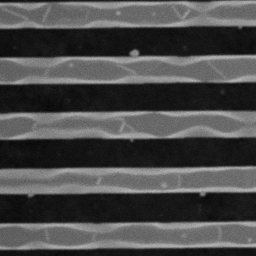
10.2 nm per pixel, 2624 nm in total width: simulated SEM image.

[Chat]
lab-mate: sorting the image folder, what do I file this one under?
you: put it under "wiring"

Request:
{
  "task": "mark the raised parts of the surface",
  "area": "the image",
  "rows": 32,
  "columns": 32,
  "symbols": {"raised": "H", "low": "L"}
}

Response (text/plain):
HHLLLHHHHLLLLLLHHHHHHHHHLLLHHHHH
HHHHHHHHHHHHHHHHHHHHHHHHHHHHHHHH
HHHHHHHHHHHHHHHHHHHHHHHHHHHHHHHH
LLLLLLLLLLLLLLLLLLLLLLLLLLLLLLLL
LLLLLLLLLLLLLLLLLLLLLLLLLLLLLLLL
LLLLLLLLLLLLLLLLLLLLLLLLLLLLLLLL
LLLLLLLLLLLLLLLLLLLLLLLLLLLLLLLL
HHLLLLLLHHHHHHHLHHHHHLLLHHHHHHHH
HHHHHHHHHHHHHHHHHHHHHHHHHHHHHHHH
HHHHHHHHHHHHHHHHHHHHHHHHHHHHHHHH
LLLLLLLLLLLLLLLLLLLLLLLLLLLLLLLL
LLLLLLLLLLLLLLLLLLLLLLLLLLLLLLLL
LLLLLLLLLLLLLLLLLLLLLLLLLLLLLLLL
LLLLLLLLLLLLLLLLLLLLLLLLLLLLLLLL
LHHHLLLLHHHHHHHHHHHHHHHHHHHHHLLL
HHHHHHHHHHHHHHHHHHHHHHHHHHHHHHHH
HHHHHHHHHHHLHHHHHHHHHHHLLLHHHHHL
LLLLLLLLLLLLLLLLLLLLLLLLLLLLLLLL
LLLLLLLLLLLLLLLLLLLLLLLLLLLLLLLL
LLLLLLLLLLLLLLLLLLLLLLLLLLLLLLLL
LLLLLLLLLLLLLLLLLLLLLLLLLLLLLLLL
LLLLLLLHHHHHHHHHHHLLHHHHHHHHHHHH
HHHHHHHHHHHHHHHHHHHHHHHHHHHHHHHH
HHHHHHHHHHHHHHHHHHHHHHHHHHHHHHHH
LLLLLLLLLLLLLLLLLLLLLLLLLLLLLLLL
LLLLLLLLLLLLLLLLLLLLLLLLLLLLLLLL
LLLLLLLLLLLLLLLLLLLLLLLLLLLLLLLL
LLLLLLLLLLLLLLLLLLLLLLLLLLLLLLLL
HHHHHHHHHHHLLHHHHHHHHHHHHHHHHHHH
HHHHHHHHHHHHHHHHHHHHHHHHHHHHHHHH
HHHHHHHHHHHHHLLHHHHHHHHHHHHHHHHH
LLLLLLLLLLLLLLLLLLLLLLLLLLLLLLLL